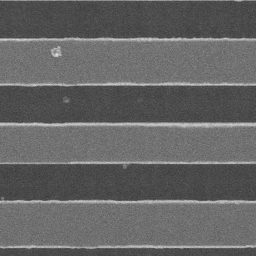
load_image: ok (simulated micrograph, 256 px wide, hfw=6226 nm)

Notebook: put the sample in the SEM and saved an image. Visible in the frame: lines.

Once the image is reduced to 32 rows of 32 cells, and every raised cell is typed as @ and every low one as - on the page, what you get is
--------------------------------
--------------------------------
--------------------------------
--------------------------------
--------------------------------
@@@@@@@@@@@@@@@@@@@@@@@@@@@@@@@@
@@@@@@@@@@@@@@@@@@@@@@@@@@@@@@@@
@@@@@@@@@@@@@@@@@@@@@@@@@@@@@@@@
@@@@@@@@@@@@@@@@@@@@@@@@@@@@@@@@
@@@@@@@@@@@@@@@@@@@@@@@@@@@@@@@@
@@@@@@@@@@@@@@@@@@@@@@@@@@@@@@@@
--------------------------------
--------------------------------
--------------------------------
--------------------------------
@@@-@---@@@@@-@@@@@@@@@-@@@@@@@@
@@@@@@@@@@@@@@@@@@@@@@@@@@@@@@@@
@@@@@@@@@@@@@@@@@@@@@@@@@@@@@@@@
@@@@@@@@@@@@@@@@@@@@@@@@@@@@@@@@
@@@@@@@@@@@@@@@@@@@@@@@@@@@@@@@@
--------------------------------
--------------------------------
--------------------------------
--------------------------------
--------------------------------
@@@@@@@@@@@@@@@@@@@@@@@@@@@@@@@@
@@@@@@@@@@@@@@@@@@@@@@@@@@@@@@@@
@@@@@@@@@@@@@@@@@@@@@@@@@@@@@@@@
@@@@@@@@@@@@@@@@@@@@@@@@@@@@@@@@
@@@@@@@@@@@@@@@@@@@@@@@@@@@@@@@@
@@@@@@@@@@@@@@@@@@@@@@@@@@@@@@@@
--------------------------------